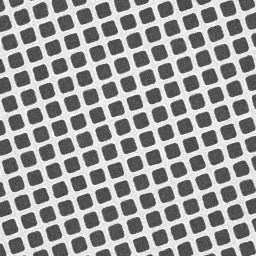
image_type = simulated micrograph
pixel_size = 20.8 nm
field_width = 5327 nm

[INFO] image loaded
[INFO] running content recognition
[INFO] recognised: a regular array of holes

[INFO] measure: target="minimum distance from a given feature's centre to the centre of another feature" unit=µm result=0.402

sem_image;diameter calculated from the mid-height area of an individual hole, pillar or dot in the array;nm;341